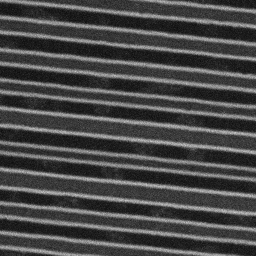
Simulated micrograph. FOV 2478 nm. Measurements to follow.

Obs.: parallel lines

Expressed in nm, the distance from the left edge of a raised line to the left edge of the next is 298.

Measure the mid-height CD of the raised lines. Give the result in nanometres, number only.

162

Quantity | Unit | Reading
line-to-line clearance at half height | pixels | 14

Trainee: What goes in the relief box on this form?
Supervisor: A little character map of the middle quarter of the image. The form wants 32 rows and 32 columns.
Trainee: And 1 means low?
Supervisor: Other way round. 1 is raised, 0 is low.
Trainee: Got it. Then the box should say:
00000000000000000000000011111111
00000000000000000000000000000000
11111111000000000000000000000000
11111111111111111000000000000000
11111111111111111111111111111000
11111111111111111111111111111111
00000001111111111111111111111111
00000000000000000111111111111111
00000000000000000000000000111111
11111111100000000000000000000000
11111111111111110100000000000000
11111111111111111111111111000000
11111111111111111111111111111111
00000000011111111111111111111111
00000000000000001111111111111111
00000000000000000000000000011111
00000000000000000000000000000000
11100000000000000000000000000000
11111111111100000000000000000000
11111111111111111111111100000000
11111111111111111111111111111110
01111111111111111111111111111111
00000000001111111111111111111111
00000000000000000000001111111111
11110000000000000000000000000111
11111111111111000000000000000000
11111111111111111111111000000000
11111111111111111111111111111111
00001111111111111111111111111111
00000000000000111111111111111111
00000000000000000000000111111111
00000000000000000000000000000000